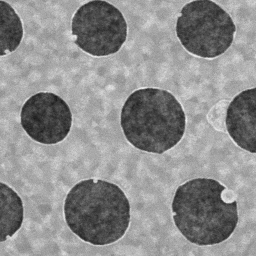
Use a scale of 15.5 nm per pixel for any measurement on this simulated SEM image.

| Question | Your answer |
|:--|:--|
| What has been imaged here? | holes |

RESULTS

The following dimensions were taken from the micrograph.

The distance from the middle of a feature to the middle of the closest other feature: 1640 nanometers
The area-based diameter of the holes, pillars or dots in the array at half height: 1020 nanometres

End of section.